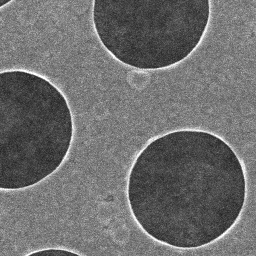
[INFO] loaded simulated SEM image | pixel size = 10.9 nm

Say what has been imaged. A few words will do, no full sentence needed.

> holes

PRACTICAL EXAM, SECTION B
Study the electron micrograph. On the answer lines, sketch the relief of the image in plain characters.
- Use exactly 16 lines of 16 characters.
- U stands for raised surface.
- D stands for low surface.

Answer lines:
UUUUUUDDDDDDDUUU
UUUUUUDDDDDDDUUU
UUUUUUDDDDDDUUUU
UUUUUUUDDDDDUUUU
DDUUUUUUUUUUUUUU
DDDUUUUUUUUUUUUU
DDDDUUUUUUUUUUUU
DDDDUUUUUUUUUUUU
DDDDUUUUUUDDDUUU
DDDDUUUUUDDDDDDU
DDDDUUUUDDDDDDDU
DDUUUUUUDDDDDDDU
UUUUUUUUDDDDDDDU
UUUUUUUUDDDDDDDU
UUUUUUUUUDDDDDUU
UUUUUUUUUUUUUUUU